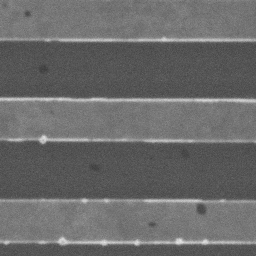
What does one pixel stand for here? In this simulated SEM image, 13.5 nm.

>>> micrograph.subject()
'lines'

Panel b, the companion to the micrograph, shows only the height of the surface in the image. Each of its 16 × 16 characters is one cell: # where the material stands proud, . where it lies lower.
################
################
...#############
................
................
................
################
################
################
................
................
................
.....##.........
################
################
................